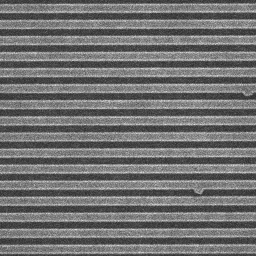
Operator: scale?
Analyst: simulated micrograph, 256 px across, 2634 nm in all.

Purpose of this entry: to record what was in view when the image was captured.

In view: parallel lines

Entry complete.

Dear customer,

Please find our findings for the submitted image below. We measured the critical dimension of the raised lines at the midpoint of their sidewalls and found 86.1 nanometres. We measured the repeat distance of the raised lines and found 0.165 micrometres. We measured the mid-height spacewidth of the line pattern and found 86.1 nanometers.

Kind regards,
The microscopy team